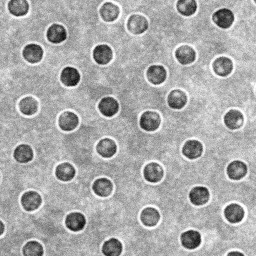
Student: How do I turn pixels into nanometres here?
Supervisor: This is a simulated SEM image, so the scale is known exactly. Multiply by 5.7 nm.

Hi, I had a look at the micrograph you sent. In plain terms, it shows a regular array of holes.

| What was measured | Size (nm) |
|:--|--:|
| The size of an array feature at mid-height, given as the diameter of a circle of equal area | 126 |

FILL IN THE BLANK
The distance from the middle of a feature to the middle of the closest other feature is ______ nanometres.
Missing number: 227